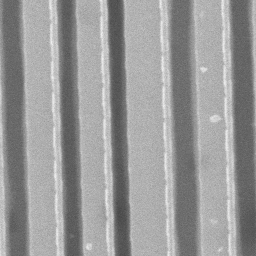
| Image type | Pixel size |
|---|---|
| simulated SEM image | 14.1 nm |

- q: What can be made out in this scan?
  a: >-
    lines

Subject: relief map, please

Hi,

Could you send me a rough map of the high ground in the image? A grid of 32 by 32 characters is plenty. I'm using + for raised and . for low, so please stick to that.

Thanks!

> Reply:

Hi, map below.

...++++...+++..++++++...+++++...
...++++...+++...+++++...+++++...
...++++...+++...+++++...+++++...
...++++...+++...+++++...+++++...
...++++...+++...+++++...+++++...
...++++...++++..+++++...+++++...
...++++...++++..+++++...+++++...
...++++...++++..+++++...+++++...
...++++...++++..+++++....++++...
...++++...++++..+++++....++++...
...++++...++++..+++++....++++...
...++++...++++..+++++....++++...
...++++...++++..+++++....++++...
...++++...++++..+++++....++++...
...++++...++++..+++++....++++...
...++++...++++..+++++....++++...
...++++...++++..+++++....++++...
...++++...++++..+++++....++++...
...+++++..++++..+++++....++++...
...+++++..++++..+++++....++++...
....++++..++++..++++++...++++...
....++++..++++..++++++...++++...
....++++..++++..++++++...++++...
....++++..++++..++++++...++++...
....++++..++++..++++++...++++...
....++++..++++..++++++...++++...
+...++++..++++..++++++...++++...
+...++++..++++..++++++...++++...
+...++++..++++..++++++...++++...
+...++++..++++..++++++...++++...
+...++++..++++..++++++...+++++..
+...++++..++++..++++++...+++++..